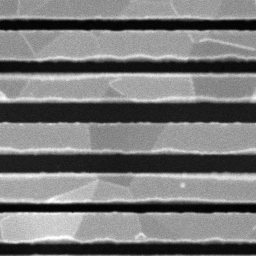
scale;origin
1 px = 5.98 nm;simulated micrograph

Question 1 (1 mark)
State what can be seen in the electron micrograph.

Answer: lines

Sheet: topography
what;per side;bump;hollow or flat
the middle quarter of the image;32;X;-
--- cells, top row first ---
--------------------------------
--------------------------------
---------XXX-XXXX-XXXX---X-----X
XXXXXXXXXXXXXXXXXXXXXXXXXXXXXXXX
XXXXXXXXXXXXXXXXXXXXXXXXXXXXXXXX
XXXXXXXXXXXXXXXXXXXXXXXXXXXXXXXX
XXXXXXXXXXXXXXXXXXXXXXXXXXXXXXXX
XXXXXXXXXXXXXXXXXXXXXXXXXXXXXXXX
XXXXXXXXXXXXXXXXXXXXXXXXXXXXXXXX
--------------------------------
--------------------------------
--------------------------------
--------------------------------
--------------------------------
--------------------------------
XXXXXXXXXXXXXXXXXXXXXXXXXXXXXXXX
XXXXXXXXXXXXXXXXXXXXXXXXXXXXXXXX
XXXXXXXXXXXXXXXXXXXXXXXXXXXXXXXX
XXXXXXXXXXXXXXXXXXXXXXXXXXXXXXXX
XXXXXXXXXXXXXXXXXXXXXXXXXXXXXXXX
XXXXXXXXXXXXXXXXXXXXXXXXXXXXXXXX
XXXXXXXXXXXXXXXXXXXXXXXXXXXXXXXX
--------------------------------
--------------------------------
--------------------------------
--------------------------------
--------------------------------
XXXXXXXXXXXXXXXXXXXXXX--XX----X-
XXXXXXXXXXXXXXXXXXXXXXXXXXXXXXXX
XXXXXXXXXXXXXXXXXXXXXXXXXXXXXXXX
XXXXXXXXXXXXXXXXXXXXXXXXXXXXXXXX
XXXXXXXXXXXXXXXXXXXXXXXXXXXXXXXX